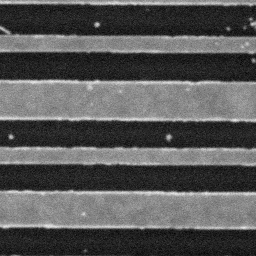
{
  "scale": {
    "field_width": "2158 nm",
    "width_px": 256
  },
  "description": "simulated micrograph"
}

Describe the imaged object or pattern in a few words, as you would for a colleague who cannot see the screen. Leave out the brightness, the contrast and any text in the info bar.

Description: lines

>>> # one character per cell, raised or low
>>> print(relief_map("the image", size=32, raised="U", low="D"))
DDDDDDDDDDDUUUUUUUUUUUUUUUUUUUUU
DDDDDDDDDDDDDDDDDDDDDDDDDDDDDDDD
DDDDDDDDDDDDDDDDDDDDDDDDDDDDDDDD
DDDDDDDDDDDDDDDDDDDDDDDDDDDDDDDD
UUUUUUUUUUDDDDDDDDDDDDDDDDDDDDDD
UUUUUUUUUUUUUUUUUUUUUUUUUUUUUUUU
DDDDDDDDDDDDDDUUUUUUUUUUUUUUUUUU
DDDDDDDDDDDDDDDDDDDDDDDDDDDDDDDD
DDDDDDDDDDDDDDDDDDDDDDDDDDDDDDDD
DDDDDDDDDDDDDDDDDDDDDDDDDDDDDDDD
UUUUUUUUUUUUUUUUUUUUUUUUUUUUUUUU
UUUUUUUUUUUUUUUUUUUUUUUUUUUUUUUU
UUUUUUUUUUUUUUUUUUUUUUUUUUUUUUUU
UUUUUUUUUUUUUUUUUUUUUUUUUUUUUUUU
UUUUUUUUUUUUUUUUUUUUUUUUUUUUUUUU
DDDDDDDDDDDDDDDDDDDDDDDDDDDDDDDD
DDDDDDDDDDDDDDDDDDDDDDDDDDDDDDDD
DDDDDDDDDDDDDDDDDDDDDDDDDDDDDDDD
UUUUUUUUUUUUDDUUUDDDDDDDDDDDDDDD
UUUUUUUUUUUUUUUUUUUUUUUUUUUUUUUU
DDDDDDDDDDUUDUDUUUUUUUUUUUUUUUUU
DDDDDDDDDDDDDDDDDDDDDDDDDDDDDDDD
DDDDDDDDDDDDDDDDDDDDDDDDDDDDDDDD
DDDDDDDDDDDDDDDDDDDDDDDDDDDDDDDD
UUUUUUUUUUUUUUUUUUUUUUUUUUUUUUUU
UUUUUUUUUUUUUUUUUUUUUUUUUUUUUUUU
UUUUUUUUUUUUUUUUUUUUUUUUUUUUUUUU
UUUUUUUUUUUUUUUUUUUUUUUUUUUUUUUU
DDDDDDDDDDDDDDDDDDDDDDUDUUUUUUUU
DDDDDDDDDDDDDDDDDDDDDDDDDDDDDDDD
DDDDDDDDDDDDDDDDDDDDDDDDDDDDDDDD
DDDDDDDDDDDDDDDDDDDDDDDDDDDDDDDD